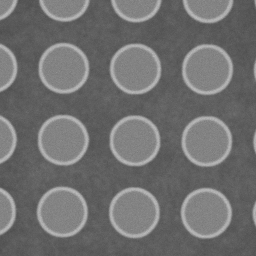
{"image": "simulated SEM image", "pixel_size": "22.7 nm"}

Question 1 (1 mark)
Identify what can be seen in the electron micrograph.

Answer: an array of small figures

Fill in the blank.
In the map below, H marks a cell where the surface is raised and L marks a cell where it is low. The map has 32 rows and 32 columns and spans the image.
HHLLLHHHHHHLLLHHHHHHLLLHHHHHHLLL
HLLLLLHHHHHLLLHHHHHHLLLHHHHHHLLL
LLLLLLLHHLLLLLLLHHLLLLLLLHHLLLLL
LLLLLLLLLLLLLLLLLLLLLLLLLLLLLLLL
LLLLLLLLLLLLLLLLLLLLLLLLLLLLLLLL
LLLLLLLHHLLLLLLLLLLLLLLLLLLLLLLL
HLLLLLHHHHLLLLLHHHHLLLLLHHHHLLLL
HHLLLHHHHHHLLLHHHHHHLLLHHHHHHLLL
HHLLLHHHHHHLLLHHHHHHLLLHHHHHHLLL
HHLLLHHHHHHLLLHHHHHHLLLHHHHHHLLL
HLLLLHHHHHLLLLHHHHHLLLLHHHHHHLLL
LLLLLLLHHLLLLLLLHHLLLLLLHHHLLLLL
LLLLLLLLLLLLLLLLLLLLLLLLLLLLLLLL
LLLLLLLLLLLLLLLLLLLLLLLLLLLLLLLL
LLLLLLLHHLLLLLLLLLLLLLLLLLLLLLLL
HLLLLHHHHHLLLLLHHHHLLLLLHHHHLLLL
HHLLLHHHHHHLLLHHHHHHLLLHHHHHHLLL
HHLLLHHHHHHLLLHHHHHHLLLHHHHHHLLL
HHLLLHHHHHHLLLHHHHHHLLLHHHHHHLLL
HLLLLHHHHHLLLLHHHHHLLLLHHHHHLLLL
LLLLLLLHHLLLLLLLHHLLLLLLHHHLLLLL
LLLLLLLLLLLLLLLLLLLLLLLLLLLLLLLL
LLLLLLLLLLLLLLLLLLLLLLLLLLLLLLLL
LLLLLLLHHLLLLLLLHLLLLLLLLLLLLLLL
HLLLLHHHHHLLLLHHHHHLLLLHHHHHLLLL
HHLLLHHHHHHLLLHHHHHHLLLHHHHHHLLL
HHLLLHHHHHHLLLHHHHHHLLLHHHHHHLLL
HHLLLHHHHHHLLLHHHHHHLLLHHHHHHLLL
HLLLLHHHHHLLLLHHHHHLLLLHHHHHLLLL
LLLLLLLHHLLLLLLLHHLLLLLLHHHLLLLL
LLLLLLLLLLLLLLLLLLLLLLLLLLLLLLLL
LLLLLLLLLLLLLLLLLLLLLLLLLLLLLLLL